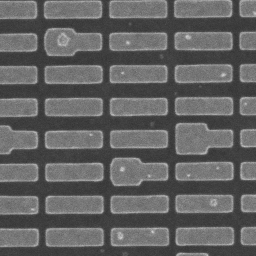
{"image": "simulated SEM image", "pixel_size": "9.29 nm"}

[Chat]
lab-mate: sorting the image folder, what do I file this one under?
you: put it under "wiring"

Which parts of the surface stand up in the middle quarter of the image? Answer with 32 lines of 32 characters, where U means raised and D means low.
UUUUUUUUUDDDUUUUUUUUUUUUUDDDUUUU
UUUUUUUUUUDDUUUUUUUUUUUUUUDDUUUU
UUUUUUUUUUDDUUUUUUUUUUUUUUDDUUUU
UUUUUUUUUUDDUUUUUUUUUUUUUUDDUUUU
UUUUUUUUUDDDUUUUUUUUUDDDDDDDUUUU
DDDDDDDDDDDDDDDDDDDDDDDDDDDDDDDD
DDDDDDDDDDDDDDDDDDDDDDDDDDDDDDDD
DDDDDDDDDDDDDDDDDDDDDDDDDDDDDDDD
DDDDDDDDDDDDDDDDDDDDDDDDDDDDUUUU
UUUUUUUUUUDDUUUUUUUUUUUUUUDDUUUU
UUUUUUUUUUDDUUUUUUUUUUUUUUDDUUUU
UUUUUUUUUUDDUUUUUUUUUUUUUUDDUUUU
UUUUUUUUUDDDUUUUUUUUUUUUUDDDUUUU
DDDDDDDDDDDDDDDDDDDDDDDDDDDDDDDD
DDDDDDDDDDDDDDDDDDDDDDDDDDDDDDDD
DDDDDDDDDDDDDDDDDDDDDDDDDDDDUUUU
DDDDDDDDDDDDDDDDDDDDDDDDDDDDUUUU
UUUUUUUUUUDDUUUUUUUUUUUUUUDDUUUU
UUUUUUUUUUDDUUUUUUUUUUUUUUDDUUUU
UUUUUUUUUUDDUUUUUUUUUUUUUUDDUUUU
UUUUUUUUUUDDUUUUUUUUUUUUUUDDUUUU
DDDDDDDDDDDDDDDDDDDDDDDDDDDDUUUU
DDDDDDDDDDDDDDDDDDDDDDDDDDDDDDDD
DDDDDDDDDDDDDDDDDDDDDDDDDDDDDDDD
DDDDDDDDDDDDUUUUUUUDDDDDDDDDDDDD
UUUUUUUUUUDDUUUUUUUUUUUUUUDDUUUU
UUUUUUUUUUDDUUUUUUUUUUUUUUDDUUUU
UUUUUUUUUUDDUUUUUUUUUUUUUUDDUUUU
UUUUUUUUUUDDUUUUUUUUUUUUUUDDUUUU
DDDDDDDDDDDDUUUUUUUDDDDDDDDDDDDD
DDDDDDDDDDDDDDDDDDDDDDDDDDDDDDDD
DDDDDDDDDDDDDDDDDDDDDDDDDDDDDDDD